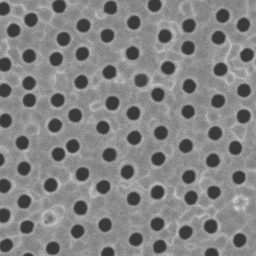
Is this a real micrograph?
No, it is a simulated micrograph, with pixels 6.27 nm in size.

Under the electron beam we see a regular array of holes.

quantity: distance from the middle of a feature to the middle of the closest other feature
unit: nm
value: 155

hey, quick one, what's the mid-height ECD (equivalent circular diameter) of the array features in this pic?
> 0.0858 micrometres